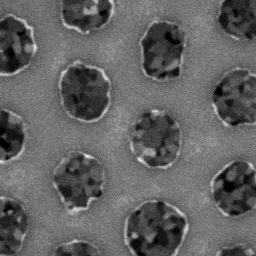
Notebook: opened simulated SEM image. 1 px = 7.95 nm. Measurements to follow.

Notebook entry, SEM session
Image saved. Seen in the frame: raised bodies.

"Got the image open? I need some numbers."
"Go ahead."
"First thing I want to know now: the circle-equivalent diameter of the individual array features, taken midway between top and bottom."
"424 nm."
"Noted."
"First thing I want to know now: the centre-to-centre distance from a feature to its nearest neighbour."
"0.69 um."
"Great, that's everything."